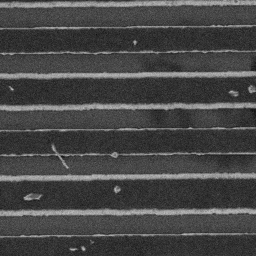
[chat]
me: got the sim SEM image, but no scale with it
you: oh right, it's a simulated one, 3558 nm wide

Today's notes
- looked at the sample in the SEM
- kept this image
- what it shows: lines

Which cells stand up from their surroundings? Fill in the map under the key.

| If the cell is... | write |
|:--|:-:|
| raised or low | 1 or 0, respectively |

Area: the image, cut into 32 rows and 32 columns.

11111111111111111000000000000000
00000000000000000000000000000000
00000000000000000000000000000000
00001111111111111111111111111111
11111111111111111111111111111111
11111111111111111111111111111111
11111111111111111111111001000000
00000000000000000000000000000000
00000000000000000000000000000000
10111011111111111111111111111111
11111111111111111111111111111111
11111111111111111111111111111111
11111111111111111111111111111111
01110001000000000000000000000000
00000000000000000000000000000000
00000000000000000000000000000000
11111111111111111111111111111111
11111111111111111111111111111111
11111111111111111111111111111111
00000000000000100000000000000000
00000000000000000000000000000000
00000000000000000000000000000000
11111111111111111111111111111111
11111111111111111111111111111111
11111111111111111111111111111111
11111111111111111111111111111111
11111111111111111101110000000000
00000000000000000000000000000000
00000000000000000000000000000000
00000000000111111111111111111111
11111111111111111111111111111111
11111111111111111111111111111111